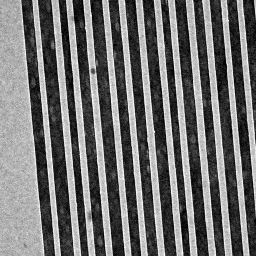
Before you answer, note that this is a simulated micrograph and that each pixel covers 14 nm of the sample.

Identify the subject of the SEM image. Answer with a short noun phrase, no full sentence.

parallel lines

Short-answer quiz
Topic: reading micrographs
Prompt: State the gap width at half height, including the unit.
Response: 150 nanometres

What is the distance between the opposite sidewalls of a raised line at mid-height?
89.1 nanometers